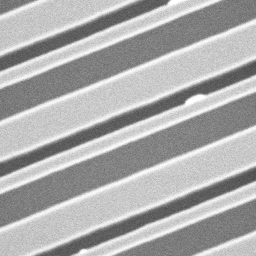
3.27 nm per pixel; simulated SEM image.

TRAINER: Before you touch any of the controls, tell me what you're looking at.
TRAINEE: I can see lines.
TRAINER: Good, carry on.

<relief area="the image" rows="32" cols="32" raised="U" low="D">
DDDDUUUUUUUUUUUUDDDDDUUUUUDDDDDD
DUUUUUUUUUUUUDDDDDDUUUUUDDDDDDDD
UUUUUUUUUUUDDDDDUUUUUDDDDDDDDDDD
UUUUUUUUUDDDDDUUUUUDDDDDDDDDDDUU
UUUUUUDDDDDUUUUUDDDDDDDDDDDUUUUU
UUUDDDDDDUUUUUDDDDDDDDDDUUUUUUUU
UDDDDDDUUUUDDDDDDDDDDDUUUUUUUUUU
DDDDUUUUUDDDDDDDDDDDUUUUUUUUUUUD
DUUUUUDDDDDDDDDDDUUUUUUUUUUUUDDD
UUUUDDDDDDDDDDDUUUUUUUUUUUUDDDDD
UDDDDDDDDDDDUUUUUUUUUUUUDDDDDUUU
DDDDDDDDDUUUUUUUUUUUUUDDDDDUUUUD
DDDDDDDUUUUUUUUUUUUUDDDDUUUUUDDD
DDDDUUUUUUUUUUUUUDDDDDUUUUUDDDDD
DDUUUUUUUUUUUUDDDDDUUUUUDDDDDDDD
UUUUUUUUUUUUDDDDDUUUUUDDDDDDDDDD
UUUUUUUUUDDDDDUUUUUDDDDDDDDDDDUU
UUUUUUUDDDDDUUUUUDDDDDDDDDDDUUUU
UUUUDDDDDUUUUUDDDDDDDDDDDUUUUUUU
UUDDDDDUUUUUDDDDDDDDDDDUUUUUUUUU
DDDDUUUUUDDDDDDDDDDDUUUUUUUUUUUU
DDUUUUDDDDDDDDDDDDUUUUUUUUUUUUDD
UUUUDDDDDDDDDDDDUUUUUUUUUUUUDDDD
UUDDDDDDDDDDDUUUUUUUUUUUUDDDDDUU
DDDDDDDDDDUUUUUUUUUUUUDDDDDDUUUU
DDDDDDDDUUUUUUUUUUUUDDDDDUUUUUDD
DDDDDUUUUUUUUUUUUUDDDDDUUUUDDDDD
DDDUUUUUUUUUUUUDDDDDUUUUUDDDDDDD
DUUUUUUUUUUUDDDDDDUUUUUDDDDDDDDD
UUUUUUUUUUDDDDDUUUUUDDDDDDDDDDDU
UUUUUUUDDDDDDUUUUDDDDDDDDDDDUUUU
UUUUUDDDDDUUUUUDDDDDDDDDDDUUUUUU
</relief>